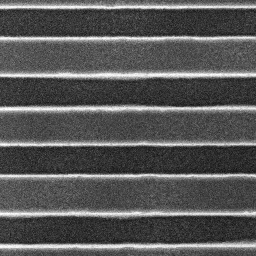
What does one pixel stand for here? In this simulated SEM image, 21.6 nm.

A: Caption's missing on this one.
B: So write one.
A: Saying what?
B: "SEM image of lines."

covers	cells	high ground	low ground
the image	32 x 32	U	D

UUUUUUUUUUUUUUUUUUUUUUUUUUUUUUUU
DDDDDDDDDDDDDDDDDDDDDDDDDDDDDDDD
DDDDDDDDDDDDDDDDDDDDDDDDDDDDDDDD
DDDDDDDDDDDDDDDDDDDDDDDDDDDDDDDD
DDDDDDDDDDDDDDDDDDDDDDDDDDDDDDDD
UUUUUUUUUUUUUUUUUUUUUUUUUUUUUUUU
UUUUUUUUUUUUUUUUUUUUUUUUUUUUUUUU
UUUUUUUUUUUUUUUUUUUUUUUUUUUUUUUU
UUUUUUUUUUUUUUUUUUUUUUUUUUUUUUUU
DDDDDDDDDDDDDDDDDDDDDDDDDDDDDDDD
DDDDDDDDDDDDDDDDDDDDDDDDDDDDDDDD
DDDDDDDDDDDDDDDDDDDDDDDDDDDDDDDD
DDDDDDDDDDDDDDDDDDDDDDDDDDDDDDDD
DDDDDDDDDDDDDDDDDDDDDDDDDDDDDDDD
UUUUUUUUUUUUUUUUUUUUUUUUUUUUUUUU
UUUUUUUUUUUUUUUUUUUUUUUUUUUUUUUU
UUUUUUUUUUUUUUUUUUUUUUUUUUUUUUUU
UUUUUUUUUUUUUUUUUUUUUUUUUUUUUUUU
DDDDDDDDDDDDDDDDDDDDDDDDDDDDDDDD
DDDDDDDDDDDDDDDDDDDDDDDDDDDDDDDD
DDDDDDDDDDDDDDDDDDDDDDDDDDDDDDDD
DDDDDDDDDDDDDDDDDDDDDDDDDDDDDDDD
UUUUUUUUUUUUUUUUUUUUUUUUUUUUUUUU
UUUUUUUUUUUUUUUUUUUUUUUUUUUUUUUU
UUUUUUUUUUUUUUUUUUUUUUUUUUUUUUUU
UUUUUUUUUUUUUUUUUUUUUUUUUUUUUUUU
UUUUUUUUUUUUUUUUUUUUUUUUUUUUUUUU
DDDDDDDDDDDDDDDDDDDDDDDDDDDDDDDD
DDDDDDDDDDDDDDDDDDDDDDDDDDDDDDDD
DDDDDDDDDDDDDDDDDDDDDDDDDDDDDDDD
DDDDDDDDDDDDDDDDDDDDDDDDDDDDDDDD
UUUUUUUUUUUUUUUUUUUUUUUUUUUUUUUU